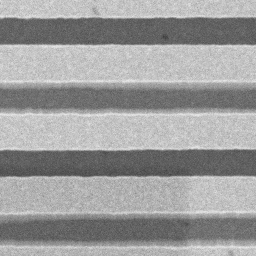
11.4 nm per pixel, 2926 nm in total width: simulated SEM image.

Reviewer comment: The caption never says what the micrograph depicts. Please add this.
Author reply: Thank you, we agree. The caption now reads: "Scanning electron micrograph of lines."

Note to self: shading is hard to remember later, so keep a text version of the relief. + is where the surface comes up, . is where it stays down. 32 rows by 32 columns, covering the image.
++++++++++++++++++++++++++++++++
++++++++++++++++++++++++++++++++
................................
................................
................................
................................
++++++++++++++++++++++++++++++++
++++++++++++++++++++++++++++++++
++++++++++++++++++++++++++++++++
++++++++++++++++++++++++++++++++
................................
................................
................................
................................
++++++++++++++++++++++++++++++++
++++++++++++++++++++++++++++++++
++++++++++++++++++++++++++++++++
++++++++++++++++++++++++++++++++
++++++++++++++++++++++++++++++++
................................
................................
................................
++++++++++++++++++++++++++++++++
++++++++++++++++++++++++++++++++
++++++++++++++++++++++++++++++++
++++++++++++++++++++++++++++++++
++++++++++++++++++++++++++++++++
................................
................................
................................
................................
++++++++++++++++++++++++++++++++